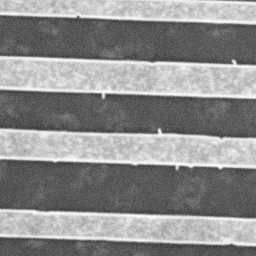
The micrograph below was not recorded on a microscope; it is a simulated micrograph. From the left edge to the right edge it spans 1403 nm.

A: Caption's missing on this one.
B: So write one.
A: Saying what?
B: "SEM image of one or a few lines or trenches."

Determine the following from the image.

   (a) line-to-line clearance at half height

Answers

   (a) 0.24 micrometres